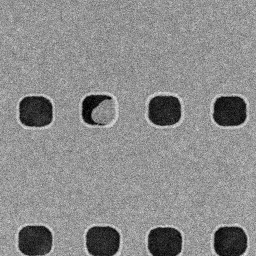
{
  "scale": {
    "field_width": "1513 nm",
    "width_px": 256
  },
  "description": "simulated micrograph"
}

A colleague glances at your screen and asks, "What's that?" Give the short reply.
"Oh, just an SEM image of holes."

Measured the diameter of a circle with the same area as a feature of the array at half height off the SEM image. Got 212 nm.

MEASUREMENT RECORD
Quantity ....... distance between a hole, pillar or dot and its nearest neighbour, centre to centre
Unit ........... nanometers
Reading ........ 380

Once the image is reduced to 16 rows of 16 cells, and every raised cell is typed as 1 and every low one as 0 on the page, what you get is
1111111111111111
1111111111111111
1111111111111111
1111111111111111
1111111111111111
1111111111111111
1001100110011001
1001100110011001
1111111111111111
1111111111111111
1111111111111111
1111111111111111
1111111111111111
1111111111111111
1001110110011001
1001100110011001